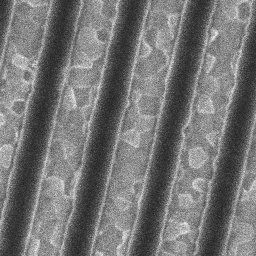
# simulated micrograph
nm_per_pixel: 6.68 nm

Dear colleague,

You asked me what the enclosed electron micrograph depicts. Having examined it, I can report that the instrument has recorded one or a few lines or trenches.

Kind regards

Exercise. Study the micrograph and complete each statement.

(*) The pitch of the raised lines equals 435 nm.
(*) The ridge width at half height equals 0.203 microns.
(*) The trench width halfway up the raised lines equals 0.229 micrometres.